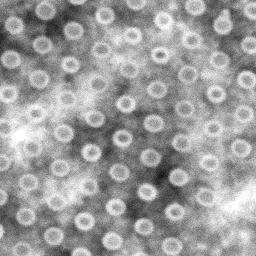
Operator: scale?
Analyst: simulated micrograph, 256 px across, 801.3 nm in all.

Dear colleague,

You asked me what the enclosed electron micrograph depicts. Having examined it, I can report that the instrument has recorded a regular array of raised bodies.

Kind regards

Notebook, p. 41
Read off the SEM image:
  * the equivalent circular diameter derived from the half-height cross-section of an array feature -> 51.5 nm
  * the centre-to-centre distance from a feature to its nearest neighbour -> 106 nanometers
